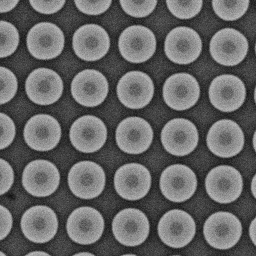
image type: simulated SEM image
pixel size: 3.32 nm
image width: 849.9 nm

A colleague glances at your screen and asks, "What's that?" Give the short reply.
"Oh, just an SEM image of an array of small figures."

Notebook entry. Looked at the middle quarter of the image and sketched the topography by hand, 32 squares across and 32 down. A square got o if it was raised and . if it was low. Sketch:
................................
.....oo.........................
...ooooooo.....ooooo........ooo.
...ooooooo....ooooooo.....oooooo
..ooooooooo...oooooooo...ooooooo
..ooooooooo..ooooooooo...ooooooo
..ooooooooo..ooooooooo...ooooooo
..ooooooooo..ooooooooo...ooooooo
...ooooooo....oooooooo...ooooooo
...oooooo.....ooooooo....ooooooo
.....ooo.......ooooo......oooooo
................................
................................
....oooo........ooo.............
...ooooooo....ooooooo.....oooooo
..oooooooo...ooooooooo...ooooooo
..ooooooooo..ooooooooo...ooooooo
.oooooooooo..ooooooooo..oooooooo
..ooooooooo..ooooooooo..oooooooo
..oooooooo...ooooooooo..oooooooo
..oooooooo....ooooooo....ooooooo
....oooo.......oooooo.....oooooo
...........................oooo.
................................
....ooo.........................
..ooooooo......ooooo.......ooo..
..oooooooo...oooooooo....ooooooo
.ooooooooo...oooooooo...oooooooo
.ooooooooo...ooooooooo..oooooooo
.ooooooooo...ooooooooo..oooooooo
.ooooooooo...ooooooooo..oooooooo
..oooooooo...oooooooo...oooooooo